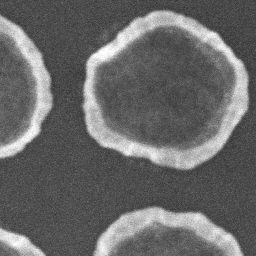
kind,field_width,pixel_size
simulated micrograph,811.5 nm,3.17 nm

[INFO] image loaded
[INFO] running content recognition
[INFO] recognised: raised bodies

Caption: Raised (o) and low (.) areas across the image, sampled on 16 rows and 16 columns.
................
.........ooo....
o.......ooooo...
oo....oooooooo..
ooo...ooooooooo.
ooo..oooooooooo.
ooo...ooooooooo.
oo....ooooooooo.
oo....oooooooo..
.........oooo...
................
................
................
.........o......
.......oooooo...
oo....ooooooooo.